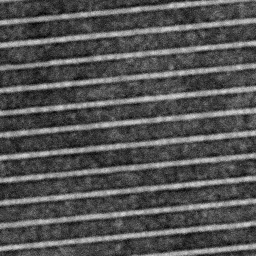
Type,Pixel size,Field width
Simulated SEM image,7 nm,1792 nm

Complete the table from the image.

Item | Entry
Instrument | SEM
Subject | parallel lines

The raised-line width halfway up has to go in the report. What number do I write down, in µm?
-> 0.0331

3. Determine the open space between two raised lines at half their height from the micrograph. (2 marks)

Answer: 125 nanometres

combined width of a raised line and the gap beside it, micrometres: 0.157